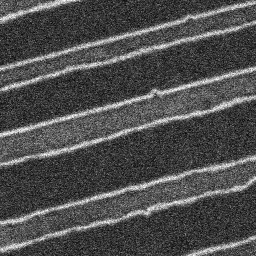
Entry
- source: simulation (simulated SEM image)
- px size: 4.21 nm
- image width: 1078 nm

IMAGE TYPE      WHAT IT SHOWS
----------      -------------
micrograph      one or a few lines or trenches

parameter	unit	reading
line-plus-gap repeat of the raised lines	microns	0.328